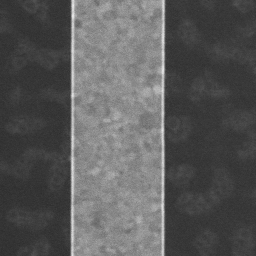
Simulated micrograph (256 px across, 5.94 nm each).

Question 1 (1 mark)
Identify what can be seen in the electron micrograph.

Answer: one or a few lines or trenches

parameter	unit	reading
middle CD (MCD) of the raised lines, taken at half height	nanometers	540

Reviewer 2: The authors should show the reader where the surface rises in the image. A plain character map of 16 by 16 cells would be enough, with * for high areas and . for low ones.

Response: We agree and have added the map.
.....*****......
.....*****......
.....*****......
.....*****......
.....*****......
.....*****......
.....*****......
.....*****......
.....*****......
.....*****......
.....*****......
.....*****......
.....*****......
.....*****......
.....*****......
.....*****......